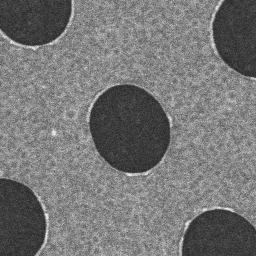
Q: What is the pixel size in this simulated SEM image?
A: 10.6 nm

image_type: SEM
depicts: holes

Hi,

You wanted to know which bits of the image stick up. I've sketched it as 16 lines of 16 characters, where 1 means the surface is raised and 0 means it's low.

0000111111111100
0000111111111000
1001111111111000
1111111111111100
1111111111111110
1111111001111111
1111110000111111
1111110000011111
1111110000011111
1111110000111111
1111111000111111
0111111111111111
0011111111111111
0001111111110001
0001111111110000
0001111111100000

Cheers